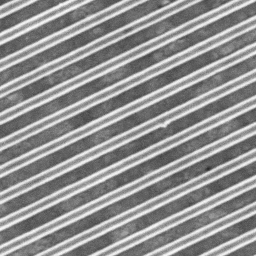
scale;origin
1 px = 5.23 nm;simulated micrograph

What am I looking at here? parallel lines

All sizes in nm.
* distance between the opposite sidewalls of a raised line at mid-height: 45.3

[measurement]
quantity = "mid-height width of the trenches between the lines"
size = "77.6 nm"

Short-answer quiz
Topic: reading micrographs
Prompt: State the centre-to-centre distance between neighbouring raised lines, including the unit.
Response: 23.9 px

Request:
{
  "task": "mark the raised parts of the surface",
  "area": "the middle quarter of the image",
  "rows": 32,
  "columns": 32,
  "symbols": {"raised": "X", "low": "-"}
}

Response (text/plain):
---------XXXX----------XXXX-----
-------XXXX----------XXXX-------
-----XXXXX---------XXXX---------
---XXXX---------XXXXX---------XX
XXXXX---------XXXXX---------XXXX
XXX---------XXXXX---------XXXXX-
X---------XXXXX---------XXXXX---
--------XXXXX---------XXXXX-----
------XXXXX---------XXXXX-------
----XXXXX---------XXXX---------X
--XXXXX---------XXXXX---------XX
XXXXX--------XXXXX---------XXXXX
XXX--------XXXXX---------XXXXX--
X--------XXXXX---------XXXXX----
-------XXXXX---------XXXXX------
-----XXXXX---------XXXXX--------
---XXXXX---------XXXXX---------X
-XXXXX---------XXXXX---------XXX
XXXX---------XXXXX--------XXXXX-
XX---------XXXXX--------XXXXX---
---------XXXXX--------XXXXX-----
-------XXXXX--------XXXXXX------
-----XXXX---------XXXXX---------
---XXXX---------XXXXX---------XX
-XXXX---------XXXXX---------XXXX
XXX---------XXXXX---------XXXXX-
X---------XXXXX---------XXXXX---
--------XXXXX---------XXXXX-----
------XXXXX---------XXXXX-------
----XXXXX---------XXXXX--------X
--XXXX----------XXXX---------XXX
XXXX---------XXXXX---------XXXXX